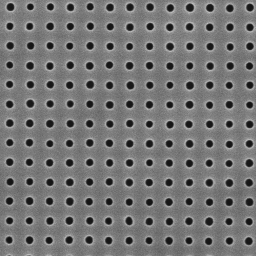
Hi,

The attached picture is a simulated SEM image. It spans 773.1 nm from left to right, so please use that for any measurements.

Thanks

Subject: a regular array of holes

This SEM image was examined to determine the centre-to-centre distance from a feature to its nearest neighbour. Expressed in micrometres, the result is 0.058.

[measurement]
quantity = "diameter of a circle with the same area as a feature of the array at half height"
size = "0.0215 µm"